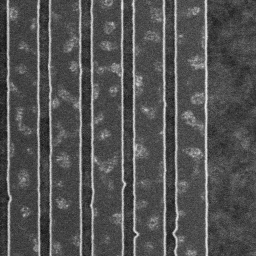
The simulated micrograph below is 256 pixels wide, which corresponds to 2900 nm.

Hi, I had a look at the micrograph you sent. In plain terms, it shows parallel lines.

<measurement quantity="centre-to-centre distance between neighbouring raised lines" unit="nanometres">474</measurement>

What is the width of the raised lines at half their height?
343 nm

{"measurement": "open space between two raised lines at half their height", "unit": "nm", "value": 127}